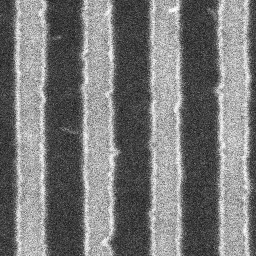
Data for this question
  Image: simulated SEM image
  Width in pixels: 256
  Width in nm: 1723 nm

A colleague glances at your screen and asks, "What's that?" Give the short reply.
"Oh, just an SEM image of one or a few lines or trenches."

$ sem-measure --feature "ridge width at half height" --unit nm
300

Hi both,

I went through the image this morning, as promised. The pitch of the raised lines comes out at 455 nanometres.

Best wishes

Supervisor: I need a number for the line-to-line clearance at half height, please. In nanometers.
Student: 153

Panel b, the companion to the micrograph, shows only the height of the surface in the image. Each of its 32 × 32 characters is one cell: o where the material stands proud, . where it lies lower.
oo...oooooo...ooooo...oooooo...o
oo...oooooo...ooooo...oooooo...o
oo...oooooo...ooooo...oooooo...o
oo...oooooo...ooooo...oooooo...o
oo...oooooo...ooooo...oooooo..oo
oo...oooooo...ooooo...oooooo...o
oo...oooooo...ooooo...oooooo...o
oo...oooooo...ooooo...oooooo...o
oo...oooooo...ooooo...oooooo...o
oo...oooooo...ooooo...oooooo...o
oo...oooooo...ooooo...oooooo...o
oo...oooooo...ooooo...oooooo...o
oo...oooooo...ooooo...oooooo...o
oo...oooooo...ooooo...oooooo...o
oo...oooooo...ooooo...oooooo...o
oo...oooooo...ooooo...oooooo...o
oo...oooooo...ooooo...oooooo...o
oo...oooooo...ooooo...oooooo...o
oo...oooooo...ooooo...oooooo...o
oo...oooooo...ooooo...oooooo..oo
oo...oooooo...ooooo...oooooo..oo
oo...oooooo...ooooo...oooooo..oo
ooo..oooooo...ooooo...oooooo...o
oo...oooooo...ooooo...oooooo...o
oo...oooooo...ooooo...oooooo...o
oo...oooooo...ooooo...oooooo...o
oo...oooooo...ooooo...oooooo...o
oo...oooooo...ooooo...oooooo...o
ooo..oooooo...ooooo...oooooo...o
oo...oooooo...ooooo...oooooo...o
ooo..oooooo..oooooo...oooooo...o
oo...oooooo...ooooo...oooooo...o